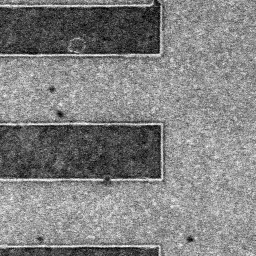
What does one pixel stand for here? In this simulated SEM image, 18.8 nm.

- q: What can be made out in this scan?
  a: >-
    one or a few lines or trenches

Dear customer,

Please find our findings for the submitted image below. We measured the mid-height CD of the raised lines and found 1050 nanometers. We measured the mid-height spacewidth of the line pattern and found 67.2 px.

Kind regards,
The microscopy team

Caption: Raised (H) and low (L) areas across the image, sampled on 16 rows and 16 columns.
HHHHHHHHHHLLLLLL
HHHHHHHHHHLLLLLL
HHHHHHHHHHLLLLLL
LLLLLLLLLLLLLLLL
LLLLLLLLLLLLLLLL
LLLLLLLLLLLLLLLL
LLLLLLLLLLLLLLLL
LLLLLLLLLLLLLLLL
HHHHHHHHHHLLLLLL
HHHHHHHHHHLLLLLL
HHHHHHHHHHLLLLLL
LLLLLLLLLLLLLLLL
LLLLLLLLLLLLLLLL
LLLLLLLLLLLLLLLL
LLLLLLLLLLLLLLLL
HHHHHHHHHHLLLLLL